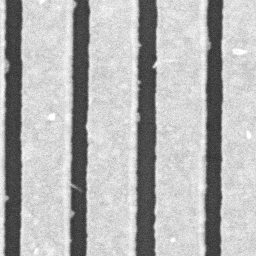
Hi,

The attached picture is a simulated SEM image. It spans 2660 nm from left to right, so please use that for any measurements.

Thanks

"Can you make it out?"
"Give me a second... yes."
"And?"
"lines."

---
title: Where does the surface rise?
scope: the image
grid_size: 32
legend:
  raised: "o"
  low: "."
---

o..oooooo..oooooo...oooooo..oooo
o..oooooo..oooooo...oooooo..oooo
o..oooooo..oooooo...oooooo..oooo
o..oooooo..oooooo...oooooo..oooo
o..oooooo..oooooo...oooooo..oooo
o..oooooo..oooooo...oooooo..oooo
...oooooo..oooooo...oooooo..oooo
o..oooooo..oooooo...oooooo..oooo
...oooooo..oooooo...oooooo..oooo
...oooooo..oooooo...oooooo..oooo
o..oooooo..oooooo...oooooo..oooo
...oooooo..oooooo...oooooo..oooo
o..oooooo..oooooo...oooooo..oooo
o..oooooo..oooooo...oooooo..oooo
...oooooo..oooooo...oooooo..oooo
...oooooo..oooooo...oooooo..oooo
...oooooo..oooooo...oooooo..oooo
...oooooo..oooooo...oooooo..oooo
...oooooo..oooooo...oooooo..oooo
...oooooo..oooooo...oooooo..oooo
...oooooo..oooooo...ooooo...oooo
...oooooo..oooooo...ooooo...oooo
...oooooo..oooooo...ooooo...oooo
...oooooo..oooooo...ooooo...oooo
...oooooo..oooooo...ooooo...oooo
...oooooo..oooooo...ooooo...oooo
...oooooo..oooooo..oooooo...oooo
...oooooo..oooooo...ooooo...oooo
...oooooo..oooooo..oooooo...oooo
...oooooo..oooooo..oooooo...oooo
...oooooo..oooooo...ooooo...oooo
...oooooo..oooooo...ooooo...oooo